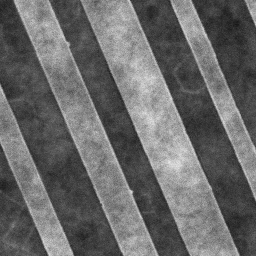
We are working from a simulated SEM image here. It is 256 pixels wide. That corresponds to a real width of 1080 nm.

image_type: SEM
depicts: one or a few lines or trenches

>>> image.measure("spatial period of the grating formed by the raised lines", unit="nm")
293